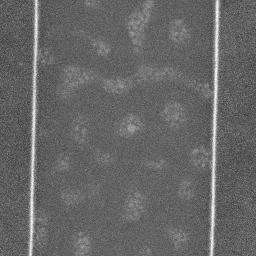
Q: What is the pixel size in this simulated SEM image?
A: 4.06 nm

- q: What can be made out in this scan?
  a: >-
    one or a few lines or trenches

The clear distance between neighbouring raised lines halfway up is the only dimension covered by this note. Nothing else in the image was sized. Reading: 730 nm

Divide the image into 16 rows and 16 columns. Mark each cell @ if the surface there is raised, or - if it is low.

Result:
@@------------@@
@@------------@@
@@------------@@
@@------------@@
@@-----------@@@
@@-----------@@@
@@-----------@@@
@@-----------@@@
@@-----------@@@
@@-----------@@@
@@-----------@@@
@@-----------@@@
@@-----------@@@
@@-----------@@@
@@-----------@@@
@@-----------@@@